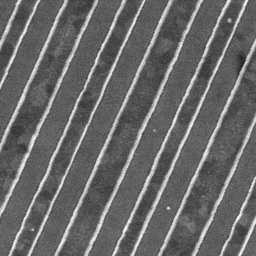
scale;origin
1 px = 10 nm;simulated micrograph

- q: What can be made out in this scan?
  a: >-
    lines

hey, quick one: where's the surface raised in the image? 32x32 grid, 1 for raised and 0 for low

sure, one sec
00111000111100011100011110001110
00110001111000011000011100001100
01110001111000111000111100011100
01100001111000110000111100011000
11100011110001110001111000111000
11000011110001110001111000111000
11000111100011100011110000110001
11000111100011100011110001110001
10001111000011000011100001100011
10001111000111000111100011100011
00011110000110000111000011000011
00011110001110001111000111000111
00011110001100001111000110000111
00111100011100011110001110001111
00111100011100011110001100001111
01111000011000111100001100011111
01111000111000111100011100011110
11110000110001111000011000111110
11110001110001111000111000111100
11100001100011110000110001111100
11100011100011110001110001111100
11100011000011110001100001111000
11000111000111100001100011111000
11000110000111100011000011110001
10001110001111000011000111110001
10001110001111000110000111100001
00011100011110000110001111100011
00011100011110001110001111000011
00011000011100001100011111000111
00111000111100011100011110000110
00110000111100011000111110001110
01110001111000111000111100001100